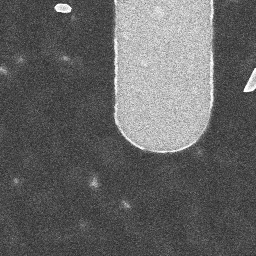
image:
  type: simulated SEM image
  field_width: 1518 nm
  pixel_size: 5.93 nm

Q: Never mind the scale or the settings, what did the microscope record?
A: one or a few lines or trenches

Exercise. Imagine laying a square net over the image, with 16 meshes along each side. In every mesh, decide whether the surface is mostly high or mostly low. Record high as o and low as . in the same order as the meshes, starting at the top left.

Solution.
ooooooo......ooo
ooooooo......ooo
ooooooo......ooo
ooooooo......ooo
ooooooo......ooo
ooooooo......ooo
ooooooo......ooo
ooooooo......ooo
oooooooo....oooo
oooooooooooooooo
oooooooooooooooo
oooooooooooooooo
oooooooooooooooo
oooooooooooooooo
oooooooooooooooo
oooooooooooooooo